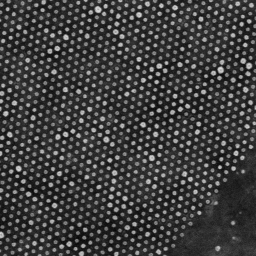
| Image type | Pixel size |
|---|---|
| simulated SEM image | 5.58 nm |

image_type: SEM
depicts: a regular array of raised bodies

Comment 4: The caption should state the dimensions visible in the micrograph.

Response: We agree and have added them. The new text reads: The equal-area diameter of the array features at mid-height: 0.0199 µm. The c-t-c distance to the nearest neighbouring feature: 0.0428 µm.